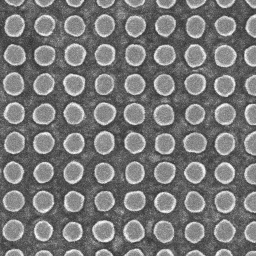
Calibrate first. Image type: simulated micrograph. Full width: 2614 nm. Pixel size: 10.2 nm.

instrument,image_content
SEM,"a regular array of raised bodies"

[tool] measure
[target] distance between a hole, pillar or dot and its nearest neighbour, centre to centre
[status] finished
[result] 296 nm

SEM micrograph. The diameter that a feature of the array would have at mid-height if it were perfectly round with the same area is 0.205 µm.